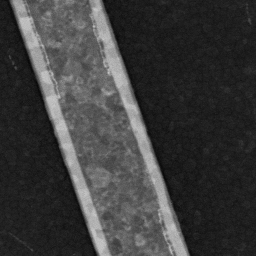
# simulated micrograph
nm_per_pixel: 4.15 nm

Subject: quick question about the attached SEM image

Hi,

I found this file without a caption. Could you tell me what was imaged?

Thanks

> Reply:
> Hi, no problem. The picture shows one or a few lines or trenches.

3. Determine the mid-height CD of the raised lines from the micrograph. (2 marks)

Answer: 0.296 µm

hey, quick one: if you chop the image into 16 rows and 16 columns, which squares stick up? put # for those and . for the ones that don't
.#####..........
..####..........
..#####.........
..#####.........
...####.........
...#####........
...#####........
....####........
....#####.......
....#####.......
.....#####......
.....#####......
.....#####......
......####......
......#####.....
......#####.....